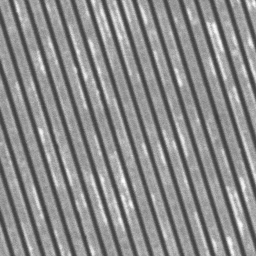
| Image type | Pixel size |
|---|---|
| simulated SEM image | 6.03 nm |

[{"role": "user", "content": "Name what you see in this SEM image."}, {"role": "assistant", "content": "parallel lines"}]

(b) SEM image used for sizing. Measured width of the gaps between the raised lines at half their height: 36.7 nanometres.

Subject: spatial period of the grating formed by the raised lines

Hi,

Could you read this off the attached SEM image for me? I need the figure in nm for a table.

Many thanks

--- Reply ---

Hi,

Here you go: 88.9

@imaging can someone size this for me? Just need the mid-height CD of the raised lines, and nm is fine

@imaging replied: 52.6